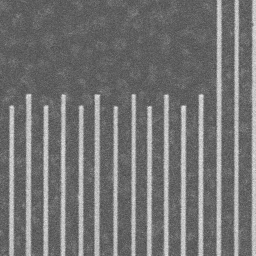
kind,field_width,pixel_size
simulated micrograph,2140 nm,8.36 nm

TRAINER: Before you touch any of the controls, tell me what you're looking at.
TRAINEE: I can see parallel lines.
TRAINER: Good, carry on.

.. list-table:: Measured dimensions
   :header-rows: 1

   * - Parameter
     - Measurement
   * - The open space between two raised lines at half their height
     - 0.113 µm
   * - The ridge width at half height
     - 0.0303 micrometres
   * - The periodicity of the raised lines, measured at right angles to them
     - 144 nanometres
